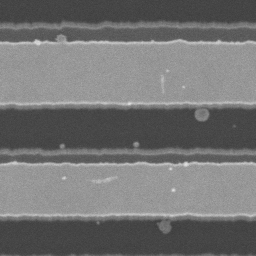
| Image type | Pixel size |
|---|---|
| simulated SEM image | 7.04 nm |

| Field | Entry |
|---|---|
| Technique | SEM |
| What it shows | lines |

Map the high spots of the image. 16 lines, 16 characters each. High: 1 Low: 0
0000000000000000
0000000000000000
1111111111111111
1111111111111111
1111111111111111
1111111111111111
1111111111101101
0000000000000000
0000000000000000
0000000000000000
1111111111111111
1111111111111111
1111111111111111
1111111111101111
0000000000000000
0000000000000000